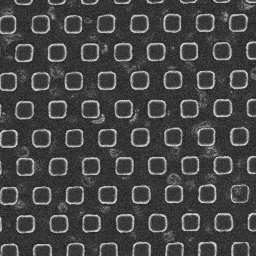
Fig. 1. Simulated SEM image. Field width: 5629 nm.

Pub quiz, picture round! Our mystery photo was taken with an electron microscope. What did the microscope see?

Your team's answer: a regular array of raised bodies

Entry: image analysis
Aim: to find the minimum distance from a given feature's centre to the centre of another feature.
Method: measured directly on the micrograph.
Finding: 718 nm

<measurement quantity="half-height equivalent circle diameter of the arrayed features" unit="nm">411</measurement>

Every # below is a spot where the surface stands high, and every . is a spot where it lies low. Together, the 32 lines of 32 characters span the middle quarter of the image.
................................
................................
.###.....####....####....####...
.###.....####....####....####...
#####....####....####....####...
#####....####....####....####...
................................
................................
................................
.....###.....####....####.....##
.....####....####....####....###
.....####....####....####....###
.....####....####....####....###
................................
................................
................................
.........###......###.....###...
#####....####....####....####...
#####....####....####....####...
.####....####....####....####...
.##......##.....................
................................
................................
..............###.....###......#
#....####....####....####....###
#....####....####....####....###
#....####....####....####.....##
.....###......###.....#.........
................................
................................
..........................#.....
.####....####....####....#####..